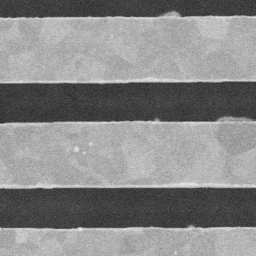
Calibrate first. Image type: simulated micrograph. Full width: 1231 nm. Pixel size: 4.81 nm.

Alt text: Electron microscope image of lines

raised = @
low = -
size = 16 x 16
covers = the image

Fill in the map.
----------------
@@@@@@@@@@@@@@@@
@@@@@@@@@@@@@@@@
@@@@@@@@@@@@@@@@
@@@@@@@@@@@@@@@@
----------------
----------------
----------------
@@@@@@@@@@@@@@@@
@@@@@@@@@@@@@@@@
@@@@@@@@@@@@@@@@
@@@@@@@@@@@@@@@@
----------------
----------------
@@@@@@@@@@@@@@@@
@@@@@@@@@@@@@@@@